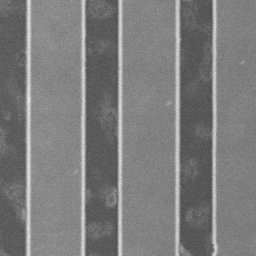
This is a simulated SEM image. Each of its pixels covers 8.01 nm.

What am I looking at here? one or a few lines or trenches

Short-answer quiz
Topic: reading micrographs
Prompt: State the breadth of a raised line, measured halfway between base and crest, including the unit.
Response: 447 nm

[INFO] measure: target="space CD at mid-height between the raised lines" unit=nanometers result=293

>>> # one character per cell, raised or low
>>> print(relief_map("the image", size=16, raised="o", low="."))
..ooo...ooo..ooo
..ooo...ooo..ooo
..ooo...ooo..ooo
..ooo...ooo..ooo
..ooo...ooo..ooo
..ooo...ooo..ooo
..ooo...ooo..ooo
..ooo...ooo..ooo
..ooo...ooo..ooo
..ooo...ooo..ooo
..ooo...ooo..ooo
..ooo...ooo..ooo
..ooo...ooo..ooo
..ooo...ooo..ooo
..ooo...ooo..ooo
..ooo...ooo..ooo